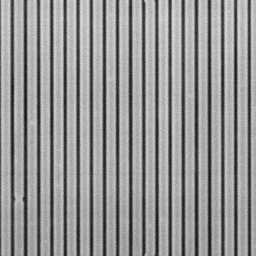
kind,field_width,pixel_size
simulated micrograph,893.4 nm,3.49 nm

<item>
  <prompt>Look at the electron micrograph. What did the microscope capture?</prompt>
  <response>parallel lines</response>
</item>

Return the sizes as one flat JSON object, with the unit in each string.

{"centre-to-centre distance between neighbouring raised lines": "46 nanometres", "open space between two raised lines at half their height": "14 nm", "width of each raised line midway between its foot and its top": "34.9 nanometres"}